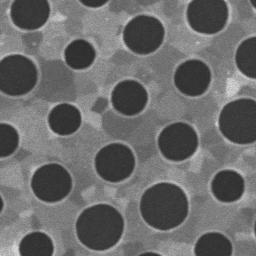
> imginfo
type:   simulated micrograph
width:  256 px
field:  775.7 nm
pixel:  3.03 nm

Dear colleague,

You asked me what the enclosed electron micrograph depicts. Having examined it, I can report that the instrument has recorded a regular array of holes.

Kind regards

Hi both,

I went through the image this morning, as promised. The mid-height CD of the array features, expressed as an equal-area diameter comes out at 124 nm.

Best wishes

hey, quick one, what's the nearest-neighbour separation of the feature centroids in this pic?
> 198 nm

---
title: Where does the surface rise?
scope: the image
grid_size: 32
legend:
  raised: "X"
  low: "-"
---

X-----XXXX---XXXXXXXXXXX----XXX-
X-----XXXXXXXXXXXXXXXXX------XXX
X-----XXXXXXXXXX----XXX------XXX
XX---XXXXXXXXXXX----XXXX----XXXX
XXXXXXXXXXXXXXX------XXXXXXXXXXX
XXXXXXXXX--XXXXX----XXXXXXXXXX--
XXXXXXXX----XXXX---XXXXXXXXXX---
----XXXX----XXXXXXXXXXX--XXXX---
-----XXXX--XXXXXXXXXXX----XXXX--
-----XXXXXXXXXXXXXXXXX----XXXXX-
----XXXXXXXXXXX---XXXX----XXXXXX
----XXXXXXXXXX----XXXX----XXXXXX
XXXXXXXXXXXXXX----XXXXXXXXXXX---
XXXXXXX---XXXX----XXXXXXXXXX----
XXXXXX----XXXXXXXXXXXXXXXXX-----
-XXXXX----XXXXXXXXXXX---XXX-----
--XXXXX--XXXXXXXXXXX-----XXX----
--XXXXXXXXXXXXXXXXXX-----XXXX---
--XXXXXXXXXXX---XXXX-----XXXXXXX
-XXXXXXXXXXX-----XXX----XXXXXXXX
XXXXXX-XXXXX-----XXXXXXXXXXXXXXX
XXXX-----XXX-----XXXXXXXXXX---XX
XXXX-----XXXX---XXXXXXXXXX-----X
XXXX-----XXXXXXXXXX----XXX-----X
XXXX----XXXXXXXXXX-----XXXX---XX
XXXXXXXXXXXX-XXXX-------XXXXXXXX
XXXXXXXXXX-----XX-------XXXXXXXX
XXXXXXXXXX-----XXX-----XXXXXXXXX
XXXXXXXXX------XXXX---XXXXXXXXXX
XXX---XXXX-----XXXXXXXXXX---XXXX
XX-----XXX----XXXXXXXXXX-----XXX
XX-----XXXXXXXXXXX-XXXXX-----XXX